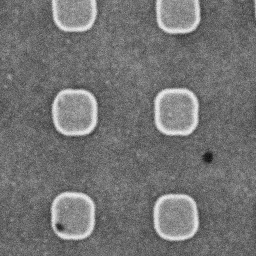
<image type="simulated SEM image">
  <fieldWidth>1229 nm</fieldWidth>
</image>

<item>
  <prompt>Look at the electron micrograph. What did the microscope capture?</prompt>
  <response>raised bodies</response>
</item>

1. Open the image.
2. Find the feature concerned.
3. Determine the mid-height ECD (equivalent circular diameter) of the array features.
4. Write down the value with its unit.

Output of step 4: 221 nanometres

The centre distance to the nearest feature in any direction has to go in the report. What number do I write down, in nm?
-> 492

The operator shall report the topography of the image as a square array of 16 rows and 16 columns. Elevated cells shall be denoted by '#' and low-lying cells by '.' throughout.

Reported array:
...###....##....
....##....##....
................
................
................
................
...###....##....
...###....##....
................
................
................
................
....##....##....
...###....##....
....##....##....
................